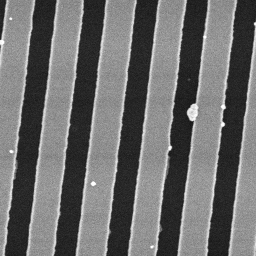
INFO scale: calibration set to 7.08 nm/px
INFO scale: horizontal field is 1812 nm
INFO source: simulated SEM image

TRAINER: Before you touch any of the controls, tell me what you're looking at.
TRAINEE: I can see lines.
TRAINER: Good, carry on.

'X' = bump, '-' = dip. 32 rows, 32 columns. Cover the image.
-XXX---XXX---XXXX---XXX---XXXX--
-XXX---XXX---XXXX---XXX---XXX---
XXXX---XXX---XXXX--XXXX---XXX---
XXXX---XXX---XXXX--XXXX---XXX---
XXXX---XXX---XXXX--XXXX--XXXX---
XXXX--XXXX---XXX---XXXX--XXXX---
XXXX--XXXX---XXX---XXXX--XXXX---
XXX---XXXX--XXXX---XXX---XXXX--X
XXX---XXXX--XXXX---XXX---XXXX--X
XXX---XXXX--XXXX---XXX---XXX---X
XXX---XXX---XXXX---XXX---XXX---X
XXX---XXX---XXXX--XXXX---XXX---X
XXX---XXX---XXXX--XXXX---XXX---X
XXX--XXXX---XXX---XXXX--XXXX---X
XXX--XXXX---XXX---XXXX--XXXX---X
XXX--XXXX--XXXX---XXX---XXXX--XX
XX---XXXX--XXXX---XXX---XXXX--XX
XX---XXX---XXXX---XXX---XXXX--XX
XX---XXX---XXXX---XXX---XXX---XX
XX---XXX---XXXX--XXXX---XXX---XX
XX---XXX---XXXX--XXXX---XXX---XX
XX--XXXX---XXXX--XXXX--XXXX---XX
XX--XXXX---XXX---XXXX--XXXX---XX
XX--XXXX---XXX---XXX---XXXX--XXX
X---XXXX--XXXX---XXX---XXXX--XXX
X---XXXX--XXXX---XXX---XXXX--XXX
X---XXX---XXXX---XXX---XXXX--XXX
X---XXX---XXXX--XXXX---XXX---XXX
X---XXX---XXXX--XXXX---XXX---XXX
X---XXX---XXXX--XXXX--XXXX---XXX
X--XXXX---XXX---XXXX--XXXX---XXX
X--XXXX---XXX---XXXX--XXXX---XXX